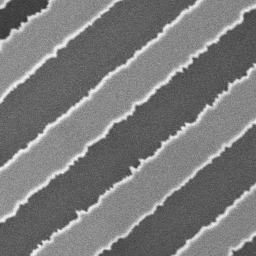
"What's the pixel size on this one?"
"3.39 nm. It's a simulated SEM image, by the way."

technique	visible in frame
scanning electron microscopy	lines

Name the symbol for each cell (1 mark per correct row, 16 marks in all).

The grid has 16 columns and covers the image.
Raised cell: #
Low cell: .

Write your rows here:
...####.....####
.#####.....####.
####......####..
###.....####....
##.....####....#
#.....####....##
.....####....###
....####....####
..####.....####.
.####.....####..
####....#####...
###....#####....
##....####.....#
#....####.....##
....####....####
..#####....####.